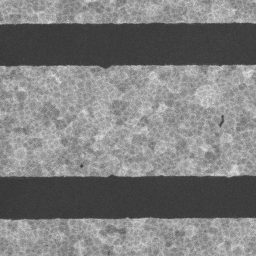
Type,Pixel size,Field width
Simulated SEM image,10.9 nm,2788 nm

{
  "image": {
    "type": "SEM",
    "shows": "one or a few lines or trenches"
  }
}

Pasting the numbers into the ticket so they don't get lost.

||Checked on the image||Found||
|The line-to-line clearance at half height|42.7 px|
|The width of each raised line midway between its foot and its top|1170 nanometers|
